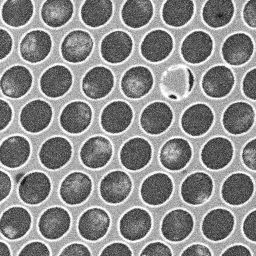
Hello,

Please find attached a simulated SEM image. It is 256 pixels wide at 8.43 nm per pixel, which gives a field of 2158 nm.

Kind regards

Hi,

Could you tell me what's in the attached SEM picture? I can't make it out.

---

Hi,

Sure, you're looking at a regular array of holes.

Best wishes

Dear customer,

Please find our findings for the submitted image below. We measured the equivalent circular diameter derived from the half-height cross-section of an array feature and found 33.3 pixels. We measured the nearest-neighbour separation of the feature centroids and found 336 nanometers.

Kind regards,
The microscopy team